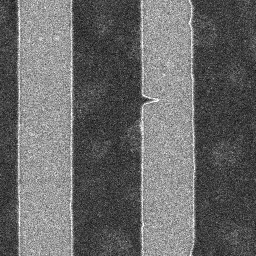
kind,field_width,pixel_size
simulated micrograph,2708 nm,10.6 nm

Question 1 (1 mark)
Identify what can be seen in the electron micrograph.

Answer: one or a few lines or trenches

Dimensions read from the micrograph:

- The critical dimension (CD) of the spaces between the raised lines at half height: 536 nanometers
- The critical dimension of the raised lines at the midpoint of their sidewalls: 757 nm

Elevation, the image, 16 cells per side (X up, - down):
X---XXXXX---XXXX
X---XXXXX---XXXX
X---XXXXX---XXXX
X---XXXXX---XXXX
X---XXXXX---XXXX
X---XXXXX---XXXX
X---XXXXX---XXXX
X---XXXXX---XXXX
X---XXXXX---XXXX
X---XXXXX---XXXX
X---XXXXX---XXXX
X---XXXXX---XXXX
X---XXXXX---XXXX
X---XXXXX---XXXX
X---XXXXX---XXXX
X----XXXX---XXXX